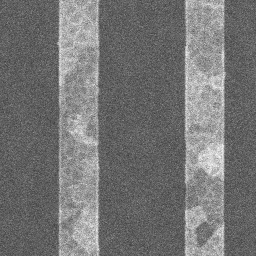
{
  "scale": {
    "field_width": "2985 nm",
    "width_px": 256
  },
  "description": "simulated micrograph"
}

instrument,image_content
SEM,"one or a few lines or trenches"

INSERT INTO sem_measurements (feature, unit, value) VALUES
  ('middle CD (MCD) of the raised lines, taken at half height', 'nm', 424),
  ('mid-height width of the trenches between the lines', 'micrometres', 1.04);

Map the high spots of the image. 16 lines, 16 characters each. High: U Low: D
DDDDUUDDDDDDUUDD
DDDDUUDDDDDDUUDD
DDDDUUDDDDDDUUDD
DDDDUUDDDDDDUUDD
DDDDUUDDDDDDUUDD
DDDDUUDDDDDDUUDD
DDDDUUDDDDDDUUDD
DDDDUUDDDDDDUUDD
DDDDUUDDDDDDUUDD
DDDDUUDDDDDDUUDD
DDDDUUDDDDDDUUDD
DDDDUUDDDDDDUUDD
DDDDUUDDDDDDUUDD
DDDDUUDDDDDDUUDD
DDDDUUDDDDDDUUDD
DDDDUUDDDDDDUUDD